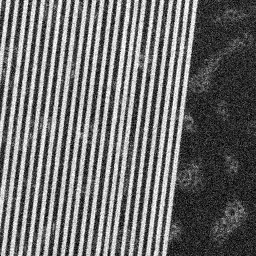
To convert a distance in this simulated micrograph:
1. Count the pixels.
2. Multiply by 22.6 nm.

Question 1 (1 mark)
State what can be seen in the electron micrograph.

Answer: parallel lines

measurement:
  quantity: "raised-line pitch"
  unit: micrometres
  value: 0.19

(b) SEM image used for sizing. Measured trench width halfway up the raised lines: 0.115 µm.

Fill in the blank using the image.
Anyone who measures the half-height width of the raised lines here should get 3.72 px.